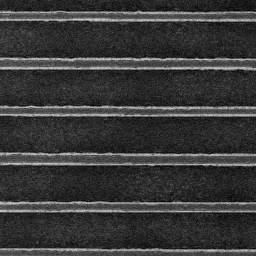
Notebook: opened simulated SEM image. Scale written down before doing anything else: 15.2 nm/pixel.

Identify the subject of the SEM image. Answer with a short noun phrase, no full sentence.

lines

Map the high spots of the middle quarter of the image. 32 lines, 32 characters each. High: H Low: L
HHHHHHHHHHHHHHHHHHHHHHHHHHHHHHHH
LLLLLLLLLLLLLLLLLLLLLLLLLLLLLLLL
LLLLLLLLLLLLLLLLLLLLLLLLLLLLLLLL
LLLLLLLLLLLLLLLLLLLLLLLLLLLLLLLL
LLLLLLLLLLLLLLLLLLLLLLLLLLLLLLLL
LLLLLLLLLLLLLLLLLLLLLLLLLLLLLLLL
LLLLLLLLLLLLLLLLLLLLLLLLLLLLLLLL
LLLLLLLLLLLLLLLLLLLLLLLLLLLLLLLL
LLLLLLLLLLLLLLLLLLLLLLLLLLLLLLLL
LLLLLLLLLLLLLLLLLLLLLLLLLLLLLLLL
LLLLLLLLLLLLLLLLLLLLLLLLLLLLLLLL
HHHHHHHHHHHHHHHHHHHHHHHHHHHHHHHH
HHHHHHHHHHHHHHHHHHHHHHHHHHHHHHHH
LLLLLLLLLLLLLLLLLLLLLLLLLLLLLLLL
LLLLLLLLLLLLLLLLLLLLLLLLLLLLLLLL
LLLLLLLLLLLLLLLLLLLLLLLLLLLLLLLL
LLLLLLLLLLLLLLLLLLLLLLLLLLLLLLLL
LLLLLLLLLLLLLLLLLLLLLLLLLLLLLLLL
LLLLLLLLLLLLLLLLLLLLLLLLLLLLLLLL
LLLLLLLLLLLLLLLLLLLLLLLLLLLLLLLL
LLLLLLLLLLLLLLLLLLLLLLLLLLLLLLLL
LLLLLLLLLLLLLLLLLLLLLLLLLLLLLLLL
LLLLLLLLLLLLLLLLLLLLLLLLLLLLLLLL
HHHHHHHHHHHHHHHHHHHHHHHHHHHHHHHH
HHHHHHHHHHHHHHHHHHHHHHHHHHHHHHHH
LLLLLLLLLLLLLLLLLLLLLLLLLLLLLLLL
LLLLLLLLLLLLLLLLLLLLLLLLLLLLLLLL
LLLLLLLLLLLLLLLLLLLLLLLLLLLLLLLL
LLLLLLLLLLLLLLLLLLLLLLLLLLLLLLLL
LLLLLLLLLLLLLLLLLLLLLLLLLLLLLLLL
LLLLLLLLLLLLLLLLLLLLLLLLLLLLLLLL
LLLLLLLLLLLLLLLLLLLLLLLLLLLLLLLL